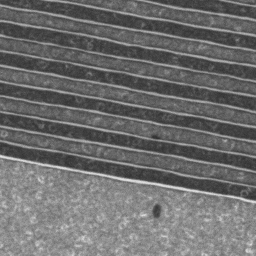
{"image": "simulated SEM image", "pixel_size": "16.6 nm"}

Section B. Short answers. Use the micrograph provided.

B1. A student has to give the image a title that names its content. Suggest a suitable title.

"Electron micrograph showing parallel lines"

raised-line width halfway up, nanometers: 243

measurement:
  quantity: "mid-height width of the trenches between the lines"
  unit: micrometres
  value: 0.243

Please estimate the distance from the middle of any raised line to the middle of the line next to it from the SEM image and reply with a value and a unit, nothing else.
493 nm